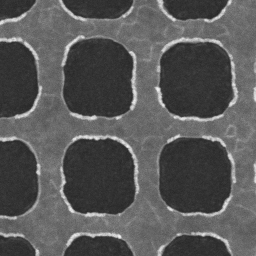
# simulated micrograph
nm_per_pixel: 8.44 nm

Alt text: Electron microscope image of holes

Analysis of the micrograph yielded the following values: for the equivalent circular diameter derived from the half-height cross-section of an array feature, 78.6 pixels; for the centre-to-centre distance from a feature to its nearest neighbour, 808 nanometres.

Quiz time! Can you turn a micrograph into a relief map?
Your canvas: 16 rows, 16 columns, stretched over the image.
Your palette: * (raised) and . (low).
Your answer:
..**....**....**
****************
*****..*********
..**....**....**
..**....**....**
..**....**.....*
..**....**....**
****************
****************
..**....**....**
..**....**....**
..**....**....**
..**....**....**
.***************
****************
..**....**....**